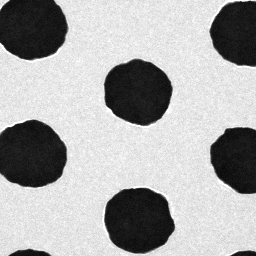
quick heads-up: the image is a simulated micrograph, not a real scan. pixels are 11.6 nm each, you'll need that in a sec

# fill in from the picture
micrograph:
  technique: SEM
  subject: holes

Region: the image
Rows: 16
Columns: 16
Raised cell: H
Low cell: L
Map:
LLLLHHHHHHHHHHLL
LLLLHHHHHHHHHLLL
LLLLHHHHHHHHHLLL
HLLHHHHHHHHHHHLL
HHHHHHHLLLHHHHHH
HHHHHHHLLLLHHHHH
HHHHHHHLLLLHHHHH
HHHHHHHHLLHHHHHH
LLLLHHHHHHHHHHLL
LLLLHHHHHHHHHLLL
LLLLHHHHHHHHHLLL
HLLHHHHHHHHHHHLL
HHHHHHHLLLHHHHHH
HHHHHHHLLLLHHHHH
HHHHHHHLLLLHHHHH
HHHHHHHLLLHHHHHH